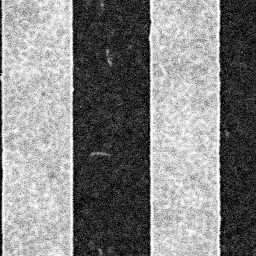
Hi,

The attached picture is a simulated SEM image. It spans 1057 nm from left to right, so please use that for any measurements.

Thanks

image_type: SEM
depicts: one or a few lines or trenches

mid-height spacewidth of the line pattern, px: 79.7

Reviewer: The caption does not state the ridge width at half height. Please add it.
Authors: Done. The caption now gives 282 nm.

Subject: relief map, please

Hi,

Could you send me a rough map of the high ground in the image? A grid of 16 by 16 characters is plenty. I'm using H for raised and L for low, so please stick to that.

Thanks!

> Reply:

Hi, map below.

HHHHLLLLLHHHHHLL
HHHHLLLLLHHHHHLL
HHHHLLLLLHHHHHLL
HHHHHLLLLHHHHHLL
HHHHLLLLLHHHHHLL
HHHHHLLLLHHHHHLL
HHHHLLLLLHHHHHLL
HHHHLLLLLHHHHHLL
HHHHLLLLLHHHHHLL
HHHHLLLLLHHHHHLL
HHHHLLLLLHHHHHLL
HHHHLLLLLHHHHHLL
HHHHLLLLLLHHHHLL
HHHHLLLLLLHHHHLL
HHHHLLLLLHHHHHLL
HHHHLLLLLLHHHHLL